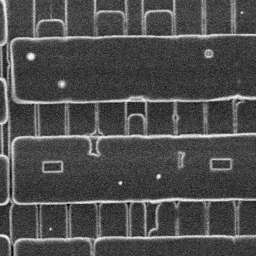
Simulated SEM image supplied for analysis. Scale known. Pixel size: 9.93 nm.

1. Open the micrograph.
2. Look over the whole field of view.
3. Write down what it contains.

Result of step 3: wiring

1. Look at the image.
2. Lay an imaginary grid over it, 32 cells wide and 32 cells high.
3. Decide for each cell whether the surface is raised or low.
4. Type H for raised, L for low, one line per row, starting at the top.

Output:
HLLLLLLLLLLLLLLLLLLLLLLLLLLLLLLL
HLLLLLLLLLLLLLLLLLLLLLLLLLLLLLLL
HLLLLLLLLLLLLLLLLLLLLLLLLLLLLLLL
HLLLLLLLLLLLLLLLLLLLLLLLLLLLLLLL
HLLLLLLLLLLLLLLLLLLLLLHHHLHHHHHH
LHHHHHHHHHHHHHHHHHHHHHHHHHHHHHHH
LHHHHHHHHHHHHHHHHHHHHHHHHHHHHHHH
LHHHHHHHHHHHHHHHHHHHHHHHHHHHHHHH
LHHHHHHHHHHHHHHHHHHHHHHHHHHHHHHH
LHHHHHHHHHHHHHHHHHHHHHHHHHHHHHHH
HLHHHHHHHHHHHHHHHHHHHHHHHHHHHHHH
HLHHHHHHHHHHHHHHHHHHHHHHHHHHHHHH
HLHHHHHHHHHHHHHHLLHHHHHHHHHLLLLL
HLLLLLLLLLLLLLLLLLLLLLLLLLLLLLLL
HLLLLLLLLLLLLLLLLLLLLLLLLLLLLLLL
LLLLLLLLLLLLLLLLLLLLLLLLLLLLLLLL
LLLLLLLLLLLLLLLLLLLLLLLLLLLLLLLL
LLHHHHHHHHHHHHHHHHHHHHHHHHHHHHHH
LLHHHHHHHHHHHHHHHHHHHHHHHHHHHHHH
HLHHHHHHHHHHHHHHHHHHHHHHHHHHHHHH
HHHHHHHHHHHHHHHHHHHHHHHHHHHHHHHH
HHHHHHHHHHHHHHHHHHHHHHHHHHHHHHHH
HHHHHHHHHHHHHHHHHHHHHHHHHHHHHHHH
HHHHHHHHHHHHHHHHHHHHHHHHHHHHHHHH
HHHHHHHHHHHHHHHHHHHHHHHHHHHHHHHH
LLHHLLLLLLLLLLLLLLLLLLLLLLLLLLLL
LLLLLLLLLLLLLLLLLLLLLLLLLLLLLLLL
LLLLLLLLLLLLLLLLLLLLLLLLLLLLLLLL
LLLLLLLLLLLLLLLLLLLLLLLLLLLLLLLL
LLLLLLLLLLLLLLLLLLLLLLLLLLLLLLLL
HLHHHHHHHHHHHHHHHHHHHHHHHHHHHHHH
HHHHHHHHHHHHHHHHHHHHHHHHHHHHHHHH